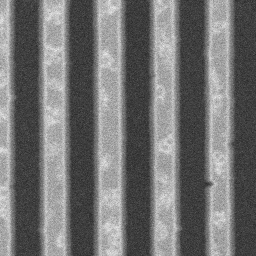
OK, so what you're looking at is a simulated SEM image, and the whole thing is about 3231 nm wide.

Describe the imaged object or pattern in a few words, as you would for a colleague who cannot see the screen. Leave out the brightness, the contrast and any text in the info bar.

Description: parallel lines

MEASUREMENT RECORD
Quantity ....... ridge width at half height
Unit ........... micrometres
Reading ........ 0.292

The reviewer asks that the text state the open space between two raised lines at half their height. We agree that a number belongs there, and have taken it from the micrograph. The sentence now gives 399 nm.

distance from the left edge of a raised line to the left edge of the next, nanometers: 694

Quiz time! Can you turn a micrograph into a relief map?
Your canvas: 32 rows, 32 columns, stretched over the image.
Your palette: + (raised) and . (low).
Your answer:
+....+++....+++....+++....+++...
+....+++....+++....+++....+++...
+....+++....+++....+++....+++...
+....+++....+++....+++....+++...
+....+++....+++....+++....+++...
+....+++....+++....+++....+++...
+....+++....+++....+++....+++...
+....+++....+++....+++....+++...
+....+++....+++....+++....+++...
+....+++....+++....+++....+++...
+....+++....+++....+++....+++...
+....+++....+++....+++....+++...
+....+++....+++....+++....+++...
+....+++....+++....+++....+++...
+....+++....+++....+++....+++...
+....+++....+++....+++....+++...
+.....++....+++....+++....+++...
+.....++....+++....+++....+++...
+.....++....+++....+++....+++...
+.....++....+++....+++....+++...
+.....++....+++....+++....+++...
+.....++....+++....+++....+++...
+....+++....+++....+++....+++...
+.....++....+++....+++....+++...
+.....++....+++....+++....+++...
+....+++....+++....+++....+++...
+....+++....+++....+++....+++...
+.....++....+++....+++....+++...
+....+++....+++....+++....+++...
+....+++....+++....+++....+++...
+.....++....+++....+++....+++...
+.....++....+++....+++....+++...